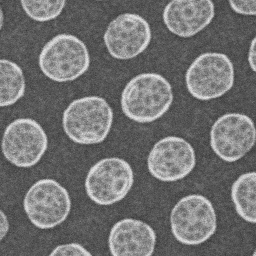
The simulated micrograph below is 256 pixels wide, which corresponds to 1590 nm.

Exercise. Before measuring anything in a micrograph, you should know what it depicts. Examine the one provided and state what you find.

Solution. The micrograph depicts a regular array of raised bodies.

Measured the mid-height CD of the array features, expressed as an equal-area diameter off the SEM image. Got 44.2 pixels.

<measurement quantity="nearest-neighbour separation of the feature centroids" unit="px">64.7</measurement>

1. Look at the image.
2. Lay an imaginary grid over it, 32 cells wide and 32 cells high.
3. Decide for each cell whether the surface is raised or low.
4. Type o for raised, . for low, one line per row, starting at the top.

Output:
...ooooo.............ooooo...ooo
...oooo..............oooooo...oo
..............oooo...ooooo......
..............oooo...oooo.......
.............oooooo....o........
......oooo...ooooo..............
......ooooo...ooo..............o
.....oooooo..............ooo...o
oo...oooooo.............ooooo...
ooo...oooo........o.....ooooo...
ooo.............ooooo...ooooo...
ooo.............ooooo...oooo....
oo.........oo..oooooo...........
.........ooooo..ooooo...........
........oooooo...ooo........oo..
..oo....oooooo.............oooo.
.oooo...ooooo..............ooooo
oooooo....oo........ooo....ooooo
ooooo..............ooooo...oooo.
.oooo..............ooooo....oo..
..oo........oooo...ooooo........
...........ooooo...oooo.........
...........ooooo..............oo
....oooo...ooooo.............ooo
...ooooo...oooo..............ooo
...oooooo.............oooo....oo
...ooooo..............ooooo...oo
o...oooo.............oooooo....o
o.............ooooo...ooooo.....
..............ooooo...oooo......
..............ooooo.............
.......oooo...ooooo.............